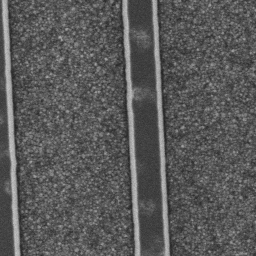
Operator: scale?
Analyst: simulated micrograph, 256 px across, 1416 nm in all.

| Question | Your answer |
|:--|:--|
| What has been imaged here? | one or a few lines or trenches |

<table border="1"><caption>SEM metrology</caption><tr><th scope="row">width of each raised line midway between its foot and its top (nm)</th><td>170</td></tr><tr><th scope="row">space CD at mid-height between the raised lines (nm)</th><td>660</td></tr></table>